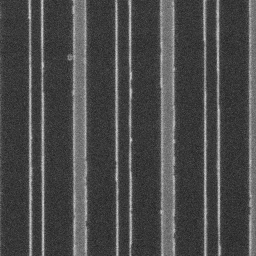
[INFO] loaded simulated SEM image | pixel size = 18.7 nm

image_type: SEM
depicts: lines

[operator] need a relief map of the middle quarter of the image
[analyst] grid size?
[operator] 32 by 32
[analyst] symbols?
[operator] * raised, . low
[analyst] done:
...**........****.......***.....
...**........****.......***.....
...**........****.......***.....
...**........****.......***.....
...**........****........**.....
...**........****........**.....
...**........****........**.....
...**........****........**.....
...**........****........**.....
...**........****........**.....
...**........****........**.....
...**........****........***....
...**........****........***....
...**........****........***....
...**........****........**.....
...**........****........**.....
...**........****........**.....
...**........****........**.....
...**........****........**.....
...**........****........**.....
...**........****........**.....
...**........****........**.....
...**........****........**.....
...**........****........**.....
...***.......****........**.....
...***.......****........**.....
...***.......****........**.....
...**........****........**.....
...**........****........**.....
...**........****........***....
...**........****........***....
...**........****........**.....